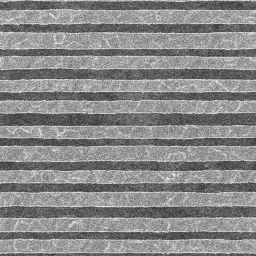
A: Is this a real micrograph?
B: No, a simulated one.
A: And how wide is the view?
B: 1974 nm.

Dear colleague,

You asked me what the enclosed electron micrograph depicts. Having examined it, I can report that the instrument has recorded parallel lines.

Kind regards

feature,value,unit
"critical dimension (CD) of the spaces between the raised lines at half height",74.2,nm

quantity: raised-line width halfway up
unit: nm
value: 100